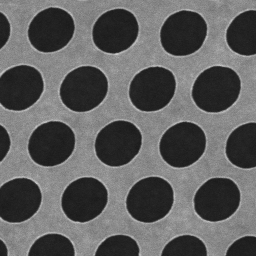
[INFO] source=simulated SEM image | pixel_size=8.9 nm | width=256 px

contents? a regular array of holes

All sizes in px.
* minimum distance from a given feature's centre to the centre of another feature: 63.8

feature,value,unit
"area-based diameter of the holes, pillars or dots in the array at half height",0.412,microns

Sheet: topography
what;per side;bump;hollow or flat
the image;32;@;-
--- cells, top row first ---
@@@@@@@@@@@@@@@@@@@@@@@@@@@@@@@@
@@@@@---@@@@@---@@@@@@--@@@@@@@-
-@@@-----@@@-----@@@@-----@@@---
-@@@-----@@@-----@@@------@@----
-@@@-----@@@-----@@@------@@----
-@@@----@@@@-----@@@-----@@@----
@@@@@-@@@@@@@--@@@@@@---@@@@@---
@@@@@@@@@@@@@@@@@@@@@@@@@@@@@@@@
@---@@@@@@--@@@@@@--@@@@@@---@@@
-----@@@-----@@@@-----@@@-----@@
-----@@@-----@@@------@@------@@
-----@@------@@@------@@------@@
-----@@@-----@@@-----@@@------@@
@--@@@@@@---@@@@@---@@@@@----@@@
@@@@@@@@@@@@@@@@@@@@@@@@@@@@@@@@
@@@@@---@@@@@@---@@@@@--@@@@@@@-
-@@@-----@@@------@@@----@@@@---
-@@@-----@@@------@@------@@----
-@@------@@@------@@------@@----
-@@@-----@@@-----@@@-----@@@----
@@@@@---@@@@@---@@@@@---@@@@@---
@@@@@@@@@@@@@@@@@@@@@@@@@@@@@@@@
@---@@@@@---@@@@@@---@@@@@---@@@
-----@@@-----@@@------@@@-----@@
-----@@@------@@------@@------@@
-----@@@-----@@@------@@------@@
-----@@@-----@@@-----@@@@----@@@
---@@@@@@--@@@@@@---@@@@@@--@@@@
@@@@@@@@@@@@@@@@@@@@@@@@@@@@@@@@
@@@@@---@@@@@@--@@@@@@@-@@@@@@@@
-@@@-----@@@@----@@@@-----@@@---
-@@@-----@@@-----@@@------@@----